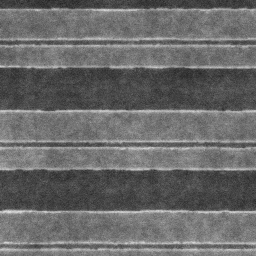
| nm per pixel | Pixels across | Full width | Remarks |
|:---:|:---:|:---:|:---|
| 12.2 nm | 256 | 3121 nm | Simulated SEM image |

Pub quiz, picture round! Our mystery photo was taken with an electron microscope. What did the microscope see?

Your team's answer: lines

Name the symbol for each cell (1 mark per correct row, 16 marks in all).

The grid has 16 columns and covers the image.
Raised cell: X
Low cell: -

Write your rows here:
----------------
XXXXXXXXXXXXXXXX
XXXXXXXXXXXXXXXX
XXXXXXXXXXXXXXXX
----------------
----------------
----------------
XXXXXXXXXXXXXXXX
XXXXXXXXXXXXXXXX
XXXXXXXXXXXXXXXX
XXXXXXXXXXXXXXXX
----------------
----------------
XXXXXXXXXXXXXXXX
XXXXXXXXXXXXXXXX
XXXXXXXXXXXXXXXX